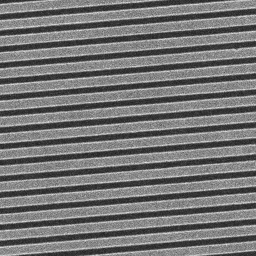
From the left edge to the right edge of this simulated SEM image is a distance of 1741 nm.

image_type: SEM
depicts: parallel lines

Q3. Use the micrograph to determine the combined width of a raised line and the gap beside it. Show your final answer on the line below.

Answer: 110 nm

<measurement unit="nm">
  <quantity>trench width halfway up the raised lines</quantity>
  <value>44.1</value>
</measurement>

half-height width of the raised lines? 68.6 nm